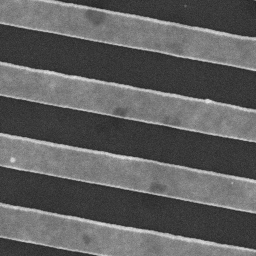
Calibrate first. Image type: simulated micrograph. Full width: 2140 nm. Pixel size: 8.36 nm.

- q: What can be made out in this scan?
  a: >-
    lines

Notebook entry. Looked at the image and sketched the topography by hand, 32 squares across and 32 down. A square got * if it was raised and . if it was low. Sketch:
*********.......................
**************..................
*******************.............
...*********************........
.........*********************..
..............******************
....................************
........................********
***...........................**
*********.......................
***************.................
********************............
...***********************......
........**********************..
..............******************
....................************
.........................*******
****..........................**
*********.......................
***************.................
*********************...........
....**********************......
.........**********************.
...............*****************
....................************
..........................******
******.........................*
***********.....................
****************................
*********************...........
.....**********************.....
..........**********************